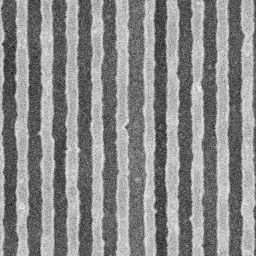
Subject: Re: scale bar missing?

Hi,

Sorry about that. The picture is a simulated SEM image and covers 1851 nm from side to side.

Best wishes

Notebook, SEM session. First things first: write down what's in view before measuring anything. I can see parallel lines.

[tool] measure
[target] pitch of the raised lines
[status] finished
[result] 181 nm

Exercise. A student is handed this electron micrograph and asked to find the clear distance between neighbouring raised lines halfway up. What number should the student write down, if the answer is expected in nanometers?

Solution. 104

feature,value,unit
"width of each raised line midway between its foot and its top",79.5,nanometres